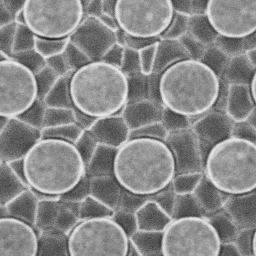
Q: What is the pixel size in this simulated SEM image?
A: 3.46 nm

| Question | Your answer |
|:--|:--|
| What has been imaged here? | raised bodies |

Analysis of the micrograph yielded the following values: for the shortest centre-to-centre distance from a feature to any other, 0.309 µm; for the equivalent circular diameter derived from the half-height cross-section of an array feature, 191 nanometres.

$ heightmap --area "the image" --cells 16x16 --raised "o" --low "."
..ooo..oooo..ooo
..ooo...oo...ooo
................
................
oo...oo...ooo...
oo..oooo..oooo..
oo...ooo..ooo...
................
................
..ooo..oooo..ooo
..ooo..oooo..ooo
..ooo...oo...ooo
................
................
oo...ooo..ooo...
oo..oooo..oooo..